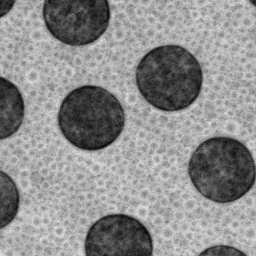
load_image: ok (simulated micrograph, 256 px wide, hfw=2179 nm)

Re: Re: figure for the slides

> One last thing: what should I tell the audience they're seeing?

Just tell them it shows holes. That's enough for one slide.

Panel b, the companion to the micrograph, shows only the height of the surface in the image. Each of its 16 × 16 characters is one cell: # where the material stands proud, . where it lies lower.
.##....#########
###....#########
####..##########
#########...####
#########....###
.####.###....###
.###....#...####
.###....########
.###...#########
############....
############....
.###########....
.############..#
.######.########
#####....#######
#####.....###..#